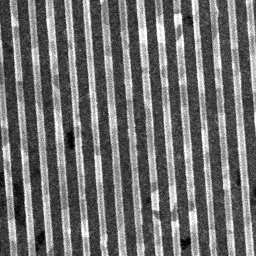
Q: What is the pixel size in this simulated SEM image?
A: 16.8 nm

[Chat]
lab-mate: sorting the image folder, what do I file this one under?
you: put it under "parallel lines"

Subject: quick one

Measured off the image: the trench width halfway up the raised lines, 218 nm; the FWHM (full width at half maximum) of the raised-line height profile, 5.23 px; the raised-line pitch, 304 nanometers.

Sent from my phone